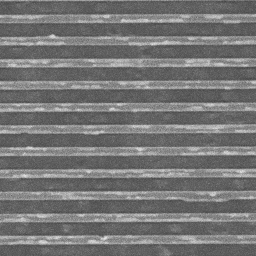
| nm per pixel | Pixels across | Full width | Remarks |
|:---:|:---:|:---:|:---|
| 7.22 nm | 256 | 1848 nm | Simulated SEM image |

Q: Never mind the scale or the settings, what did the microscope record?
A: parallel lines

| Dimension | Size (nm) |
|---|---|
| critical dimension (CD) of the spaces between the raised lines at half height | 102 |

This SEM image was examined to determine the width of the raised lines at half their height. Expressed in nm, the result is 61.4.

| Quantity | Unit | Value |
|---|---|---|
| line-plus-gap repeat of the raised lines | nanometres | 160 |